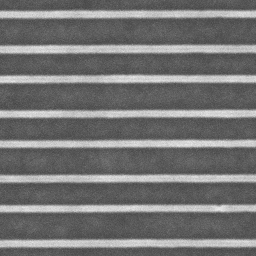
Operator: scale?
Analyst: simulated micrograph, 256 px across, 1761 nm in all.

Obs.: parallel lines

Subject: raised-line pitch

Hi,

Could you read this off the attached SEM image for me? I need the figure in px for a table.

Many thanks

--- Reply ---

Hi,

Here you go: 32.8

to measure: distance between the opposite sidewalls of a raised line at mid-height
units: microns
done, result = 0.0396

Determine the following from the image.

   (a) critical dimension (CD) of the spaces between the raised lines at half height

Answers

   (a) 200 nanometers